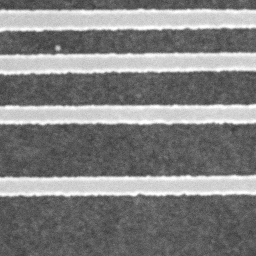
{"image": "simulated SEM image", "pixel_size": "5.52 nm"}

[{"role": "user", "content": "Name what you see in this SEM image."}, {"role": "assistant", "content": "lines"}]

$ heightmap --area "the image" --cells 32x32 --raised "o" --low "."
................................
oooooooooooooooooooooooooooooooo
oooooooooooooooooooooooooooooooo
ooooooooooooooooooooooo.o.......
................................
................................
................................
oooooooooooooooooooooooooooooooo
oooooooooooooooooooooooooooooooo
................................
................................
................................
................................
oooooooooooooooooooooooooooooooo
oooooooooooooooooooooooooooooooo
................................
................................
................................
................................
................................
................................
................................
oooooooooooooooooooooooooooooooo
oooooooooooooooooooooooooooooooo
................................
................................
................................
................................
................................
................................
................................
................................